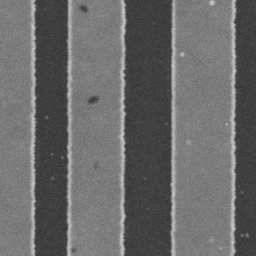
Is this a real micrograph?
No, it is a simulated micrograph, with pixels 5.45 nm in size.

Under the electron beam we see lines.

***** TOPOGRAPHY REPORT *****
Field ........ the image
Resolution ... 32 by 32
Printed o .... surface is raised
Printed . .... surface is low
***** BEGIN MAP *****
oooo.....ooooooo......ooooooo...
oooo.....ooooooo......ooooooo...
oooo.....ooooooo......ooooooo...
oooo.....ooooooo......ooooooo...
oooo.....ooooooo......ooooooo...
oooo....oooooooo......ooooooo...
oooo.....ooooooo......ooooooo...
oooo.....oooooo.......ooooooo...
oooo....ooooooo.......ooooooo...
oooo.....oooooo.......ooooooo...
oooo....oooooooo......ooooooo...
oooo....ooooooo.......ooooooo...
oooo....oooooooo......ooooooo...
oooo....ooooooo.......ooooooo...
oooo.....ooooooo......ooooooo...
oooo.....oooooo.......ooooooo...
oooo.....oooooo.......ooooooo...
oooo.....oooooo.......ooooooo...
oooo....oooooooo......ooooooo...
oooo....oooooooo......ooooooo...
oooo.....oooooo.......ooooooo...
oooo....ooooooo.......ooooooo...
oooo....ooooooo.......ooooooo...
oooo....ooooooo......oooooooo...
oooo....ooooooo.......ooooooo...
oooo.....oooooo.......ooooooo...
oooo....oooooooo......ooooooo...
oooo....ooooooo.......ooooooo...
oooo....ooooooo.......ooooooo...
oooo....ooooooo......oooooooo...
oooo....ooooooo.......ooooooo...
oooo....ooooooo.......ooooooo...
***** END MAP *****